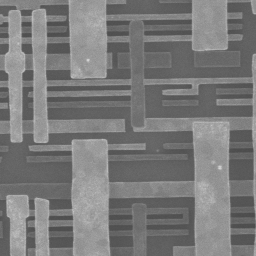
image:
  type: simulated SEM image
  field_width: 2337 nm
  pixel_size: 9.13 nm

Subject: wiring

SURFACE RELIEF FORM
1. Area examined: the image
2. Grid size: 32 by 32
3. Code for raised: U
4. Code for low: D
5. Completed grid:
DDDDDDDDDUUUUDDDDDDDDDDDUUUUDDDU
DUDDUUDDDUUUUDDDDDDDDDDDUUUUDDDD
DUUDUUDDDUUUUDDDDDDDDDDDUUUUDDDD
DUUDUUDDDUUUUDDDUUDDDDDDUUUUDDDD
DUUDUUDDDUUUUDDDUUDDDDDDUUUUDDDD
DUUDUUDDDUUUUDDDUUDDDDDDUUUUDDDD
DUUDUUDDDUUUUDDDUUDDDDDDDDDDDDDD
DUUDUUDDDUUUUDDDUUDDDDDDDDDDDDDD
DUUDUUDDDUUUUDDDUUDDDDDDDDDDDDDD
DUUDUUDDDUUUUDDDUUDDDDDDDDDDDDDD
DUUDUUDDDDDDDDDDUUDDDDDDDDDDDDDD
DUUDUUDDDDDDDDDDUUDDDDDDDDDDDDDD
DUUDUUDDDDDDDDDDUUDDDDDDDDDDDDDD
DUUDUUDDDDDDDDDDUUDDDDDDDDDDDDDD
DUUDUUDDDDDDDDDDUUDDDDDDDDDDDDDD
DUUDUUDDDDDDDDDDUUDDDDDDUUUUUDDD
DUUDUUDDDDDDDDDDDDDDDDDDUUUUUDDD
DUUDUUDDDDDUUDDDDDDDDDDDUUUUUDDD
DDDDDDDDDUUUUDDDDDDDDDDDUUUUUDDD
DDDDDDDDDUUUUDDDDDDDDDDDUUUUUDDD
DDDDDDDDDUUUUDDDDDDDDDDDUUUUUDDD
DDDDDDDDDUUUUUDDDDDDDDDDUUUUUDDD
DDDDDDDDDUUUUUDDDDDDDDDDUUUUUDDD
DDDDDDDDDUUUUUDDDDDDDDDDUUUUUDDD
DUUDDDDDDUUUUUDDDDDDDDDDUUUUUDDD
DUUUUUDDDUUUUUDDDDDDDDDDUUUUUDDD
DUUUUUDDDUUUUUDDDUDDDDDDUUUUUDDD
DUUDUUDDDUUUUUDDDUDDDDDDUUUUUDDD
DUUDUUDDDUUUUUDDDUDDDDDDUUUUUDDD
DUUDUUDDDUUUUUDDDUDDDDDDUUUUUDDD
DUUDUUDDDUUUUUDDDUDDDDDDUUUUUDDD
DUUDUUDDDUUUUUDDDUDDDDDDDUUUUDDD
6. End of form